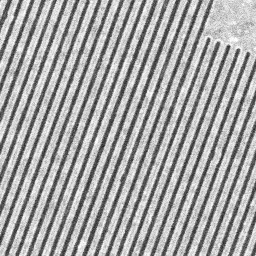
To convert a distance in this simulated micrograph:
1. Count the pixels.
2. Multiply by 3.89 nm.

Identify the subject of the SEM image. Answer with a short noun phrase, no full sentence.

parallel lines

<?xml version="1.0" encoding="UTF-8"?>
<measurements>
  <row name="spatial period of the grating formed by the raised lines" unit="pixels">10.5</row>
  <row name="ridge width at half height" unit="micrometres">0.0196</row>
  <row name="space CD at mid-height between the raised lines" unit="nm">19.6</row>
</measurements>